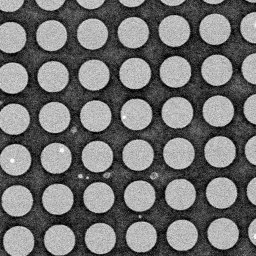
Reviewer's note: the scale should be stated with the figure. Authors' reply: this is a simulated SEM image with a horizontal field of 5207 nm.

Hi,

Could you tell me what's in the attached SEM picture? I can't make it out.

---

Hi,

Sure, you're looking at an array of small figures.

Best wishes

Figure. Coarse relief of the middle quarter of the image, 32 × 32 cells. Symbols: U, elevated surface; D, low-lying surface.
DDDDUUUUUUUDDDUUUUUUUDDDUUUUUUUD
UDDDUUUUUUUDDDUUUUUUUUDDUUUUUUUU
UDDDUUUUUUUDDDUUUUUUUUDDUUUUUUUU
UDDDUUUUUUUDDDUUUUUUUDDDUUUUUUUD
UDDDUUUUUUUDDDDUUUUUUDDDDUUUUUUD
DDDDDUUUUUDDDDDUUUUUDDDDDDUUUDDD
DDDDDDDDDDDDDDDDDDDDDDDDDDDDDDDD
DDDDDDDDDDDDDDDDDDDDDDDDDDDDDDDD
DDDDDDDDDDDDDDDDDDDDDDDDDDDUUDDD
DDDDDDUUUUDDDDDDUUUUDDDDDUUUUUUD
DDDDDUUUUUUDDDDUUUUUUDDDDUUUUUUU
UDDDUUUUUUUDDDUUUUUUUUDDDUUUUUUU
UDDDUUUUUUUUDDUUUUUUUUDDDUUUUUUU
UDDDUUUUUUUUDDUUUUUUUUDDDUUUUUUU
UDDDUUUUUUUDDDDUUUUUUDDDDUUUUUUD
UDDDDUUUUUUDDDDDUUUUUDDDDDUUUUDD
DDDDDDUUUUDDDDDDDDDDDDDDDDDDDDDD
DDDDDDDDDDDDDDDDDDDDDDDDDDDDDDDD
DDDDDDDDDDDDDDDDDDDDDDDDDDDDDDDD
DDDDDDDUUDDDDDDDDUUUUDDDDDUUUUUD
DDDDDDUUUUUDDDDUUUUUUUDDDUUUUUUU
UDDDDUUUUUUUDDDUUUUUUUDDDUUUUUUU
UUDDDUUUUUUUDDDUUUUUUUDDDUUUUUUU
UUDDDUUUUUUUDDDUUUUUUUDDDUUUUUUU
UUDDDUUUUUUUDDDUUUUUUUDDDUUUUUUU
UDDDDUUUUUUDDDDDUUUUUDDDDDUUUUUD
DDDDDDUUUUDDDDDDDDUDDDDDDDDDDDDD
DDDDDDDDDDDDDDDDDDDDDDDDDDDDDDDD
DDDDDDDDDDDDDDDDDDDDDDDDDDDDDDDD
DDDDDDDDDDDDDDDDDUUUDDDDDDDUUUUD
DDDDDDUUUUUDDDDDUUUUUUDDDDUUUUUU
UUDDDUUUUUUUDDDUUUUUUUDDDUUUUUUU